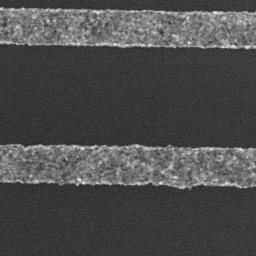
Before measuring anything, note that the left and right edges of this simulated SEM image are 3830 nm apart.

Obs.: one or a few lines or trenches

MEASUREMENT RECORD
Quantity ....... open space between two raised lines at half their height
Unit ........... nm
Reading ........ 1510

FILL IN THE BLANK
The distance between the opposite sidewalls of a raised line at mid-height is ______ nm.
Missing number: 525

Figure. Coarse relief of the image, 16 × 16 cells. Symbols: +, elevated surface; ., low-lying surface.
................
++++++++++++++++
++++++++++++++++
................
................
................
................
................
................
++++++++++++++++
++++++++++++++++
.......++.++++++
................
................
................
................